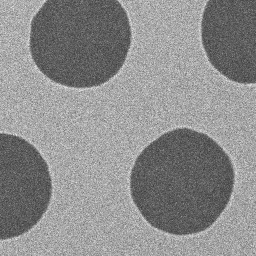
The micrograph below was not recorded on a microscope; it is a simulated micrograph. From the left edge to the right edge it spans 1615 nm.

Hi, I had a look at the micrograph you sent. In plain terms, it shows holes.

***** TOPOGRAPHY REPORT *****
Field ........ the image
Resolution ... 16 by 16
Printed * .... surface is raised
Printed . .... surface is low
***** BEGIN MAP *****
***.....*****...
**......*****...
**......*****...
**......*****...
***....*******..
*****.**********
****************
****************
.*********...***
..*******.....**
...*****.......*
...*****.......*
...*****......**
...******.....**
..********..****
****************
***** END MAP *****